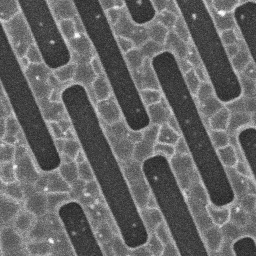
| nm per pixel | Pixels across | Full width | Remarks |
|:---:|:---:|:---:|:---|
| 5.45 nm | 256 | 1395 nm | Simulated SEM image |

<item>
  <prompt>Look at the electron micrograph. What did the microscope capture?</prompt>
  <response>holes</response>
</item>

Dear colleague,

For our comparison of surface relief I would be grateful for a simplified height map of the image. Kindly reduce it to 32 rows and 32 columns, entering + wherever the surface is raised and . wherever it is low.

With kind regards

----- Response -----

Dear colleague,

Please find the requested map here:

++....+++....+++...+++....++++..
+++...++++...+++...++++...+++...
+++....+++...++++..++++....++...
++++...++++...+++++++++....+++..
.+++....+++...++++++++++...+++..
.++++...++++...+++++++++....+++.
..+++....+++...++++++++++...+++.
..+++....++++...+++...+++....+++
...+++.++++++...+++...++++...+++
...++++++++++...++++...+++....++
....++++++++++...+++...+++....++
+...++++...+++...+++....+++...++
+...++++...++++...+++...+++..+++
++...+++....+++...+++....+++++++
++...++++...++++...+++...+++++++
++....+++...++++...+++...+++++++
+++...+++....++++++++++...++++..
+++....+++...++++++++++...++++..
++++...+++....++++++++++...+++..
++++...++++...+++++.++++...++++.
+++++..++++....+++...+++....+++.
++++++++++++...+++....+++...+++.
++++++++++++....++....+++....+++
++++++++++++....+++....+++...+++
+++++++++++++...+++....+++...+++
++++++++..+++....+++...++++.++++
+++++++....+++...+++....++++++++
++++++++...+++....+++...++++++++
++++++++...++++...+++....+++++++
+++++++++...+++...+++....+++++++
+++++++++...++++..++++...++++...
+++++++++....+++++++++....+++...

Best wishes